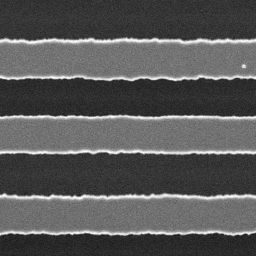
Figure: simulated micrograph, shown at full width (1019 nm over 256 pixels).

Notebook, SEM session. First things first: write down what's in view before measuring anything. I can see lines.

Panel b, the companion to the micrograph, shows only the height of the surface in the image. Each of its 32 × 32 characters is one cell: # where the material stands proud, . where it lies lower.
................................
................................
................................
................................
................................
################################
################################
################################
################################
################################
................................
................................
................................
................................
................................
################################
################################
################################
################################
................................
................................
................................
................................
................................
#...................#...........
################################
################################
################################
################################
................................
................................
................................